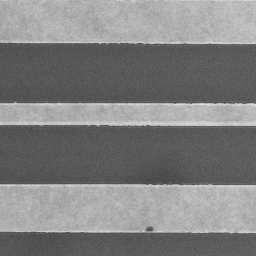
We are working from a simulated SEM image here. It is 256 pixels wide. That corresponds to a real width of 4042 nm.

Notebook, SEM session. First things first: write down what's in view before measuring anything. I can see lines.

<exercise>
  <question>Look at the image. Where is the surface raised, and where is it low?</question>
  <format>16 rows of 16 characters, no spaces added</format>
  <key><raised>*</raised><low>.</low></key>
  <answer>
****************
****************
****************
................
................
................
****************
****************
................
................
................
................
****************
****************
............*.**
................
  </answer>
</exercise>